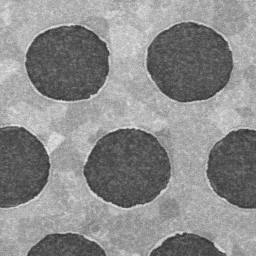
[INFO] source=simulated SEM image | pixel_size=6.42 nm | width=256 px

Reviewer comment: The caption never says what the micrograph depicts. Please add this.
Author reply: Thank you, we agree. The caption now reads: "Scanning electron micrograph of holes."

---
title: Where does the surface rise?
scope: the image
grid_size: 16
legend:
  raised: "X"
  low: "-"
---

XXXXXXXXXXXXXXXX
XXXXXXXXXXX-XXXX
XX----XXXX----XX
XX-----XX-----XX
XX-----XX-----XX
XX----XXXX----XX
XXXXXXXXXXXXXXXX
XXXXXXXXXXXXXXXX
--XXXX----XXXX--
---XXX----XXX---
---XX------XX---
---XX-----XXX---
--XXXXX---XXXX--
XXXXXXXXXXXXXXXX
XXXXXXXXXXXXXXXX
XX----XXXX----XX